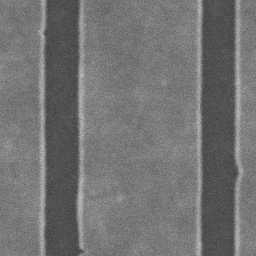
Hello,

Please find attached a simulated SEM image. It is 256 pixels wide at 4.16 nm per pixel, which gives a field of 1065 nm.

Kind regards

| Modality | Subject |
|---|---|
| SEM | one or a few lines or trenches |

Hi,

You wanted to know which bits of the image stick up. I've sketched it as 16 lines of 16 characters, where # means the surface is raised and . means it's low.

###..#######...#
###..#######...#
###..#######...#
###..#######...#
###..#######...#
###..#######...#
###..#######...#
###..#######...#
###..#######...#
###..#######...#
###..#######...#
###..#######...#
###..#######...#
###..#######...#
###..#######...#
###..#######...#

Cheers